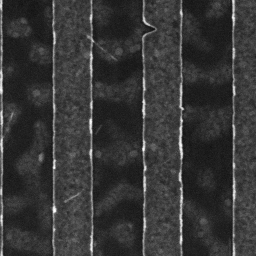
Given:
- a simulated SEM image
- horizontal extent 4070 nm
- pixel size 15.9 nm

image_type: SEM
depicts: one or a few lines or trenches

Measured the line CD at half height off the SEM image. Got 610 nm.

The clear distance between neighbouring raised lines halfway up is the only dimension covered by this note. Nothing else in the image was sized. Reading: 811 nm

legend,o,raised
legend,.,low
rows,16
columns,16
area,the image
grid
...ooo...oo....o
...ooo...oo....o
...ooo...oo....o
...ooo...oo....o
...ooo...oo....o
...ooo...oo....o
...ooo...oo....o
...ooo...oo....o
...ooo...oo....o
...ooo...oo....o
...ooo...oo....o
...ooo...oo....o
...ooo...oo....o
...ooo...oo....o
...ooo...oo....o
...ooo...oo....o